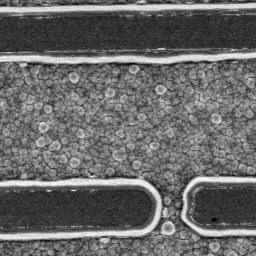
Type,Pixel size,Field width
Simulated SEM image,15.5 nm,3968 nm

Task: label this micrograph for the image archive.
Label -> one or a few lines or trenches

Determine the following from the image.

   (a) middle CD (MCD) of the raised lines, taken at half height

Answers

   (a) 785 nm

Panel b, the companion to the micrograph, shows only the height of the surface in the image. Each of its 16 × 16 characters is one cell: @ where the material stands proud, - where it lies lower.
-------@--@@@@@@
@@@@@@@@@@@@@@@@
@@@@@@@@@@@@@@@@
@@@@@@@@@@@@@@--
----------------
----------------
----------------
----------------
----------------
----------------
----------------
@@@@@@@@@---@@@@
@@@@@@@@@@--@@@@
@@@@@@@@@@--@@@@
@@@@@@@@@----@@@
----------------